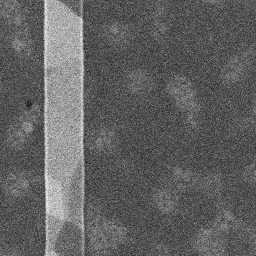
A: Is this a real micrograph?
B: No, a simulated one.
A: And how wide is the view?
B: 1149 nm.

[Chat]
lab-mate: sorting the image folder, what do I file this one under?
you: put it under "one or a few lines or trenches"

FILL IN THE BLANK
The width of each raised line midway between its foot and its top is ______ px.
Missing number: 36.9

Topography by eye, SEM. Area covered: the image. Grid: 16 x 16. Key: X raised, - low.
---XX-----------
---XX-----------
---XX-----------
---XX-----------
---XX-----------
---XX-----------
---XX-----------
---XX-----------
---XX-----------
---XX-----------
---XX-----------
---XX-----------
---XX-----------
---XX-----------
---XX-----------
---XX-----------